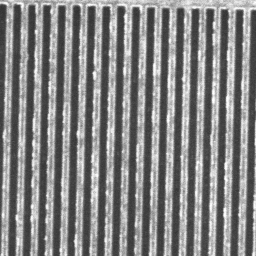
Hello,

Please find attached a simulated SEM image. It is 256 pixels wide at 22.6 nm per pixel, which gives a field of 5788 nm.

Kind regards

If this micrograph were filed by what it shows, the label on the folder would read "parallel lines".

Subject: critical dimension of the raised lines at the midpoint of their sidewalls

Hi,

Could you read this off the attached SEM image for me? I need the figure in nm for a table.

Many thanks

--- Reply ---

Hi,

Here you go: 170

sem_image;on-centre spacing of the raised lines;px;14.8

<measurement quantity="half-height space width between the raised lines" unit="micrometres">0.17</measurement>